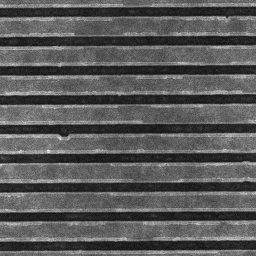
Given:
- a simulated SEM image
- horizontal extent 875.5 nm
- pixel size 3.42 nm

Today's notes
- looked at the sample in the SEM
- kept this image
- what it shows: parallel lines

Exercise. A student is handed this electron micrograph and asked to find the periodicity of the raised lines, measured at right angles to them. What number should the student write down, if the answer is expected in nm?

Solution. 99.9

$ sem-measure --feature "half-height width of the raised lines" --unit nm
65.4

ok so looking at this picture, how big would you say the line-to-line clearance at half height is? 10.4 pixels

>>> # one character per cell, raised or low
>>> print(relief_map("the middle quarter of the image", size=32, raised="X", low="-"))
--------------------------------
--------------------------------
--------------------------------
XXXXXXXXXXXXXXXXXXXXXXXXXXXXXXXX
XXXXXXXXXXXXXXXXXXXXXXXXXXXXXXXX
XXXXXXXXXXXXXXXXXXXXXXXXXXXXXXXX
XXXXXXXXXXXXXXXXXXXXXXXXXXXXXXXX
XXXXXXXXXXXXXXXXXX--------------
--------------------------------
--------------------------------
XXXXXXXXXXXXXXXXXXXXXXXXXXXXXXXX
XXXXXXXXXXXXXXXXXXXXXXXXXXXXXXXX
XXXXXXXXXXXXXXXXXXXXXXXXXXXXXXXX
XXXXXXXXXXXXXXXXXXXXXXXXXXXXXXXX
XXXXXXXXXXXXXXXXXXXXXXXXXXXXXXXX
--------------------------------
--------------------------------
---------------------------XXXXX
XXXXXXXXXXXXXXXXXXXXXXXXXXXXXXXX
XXXXXXXXXXXXXXXXXXXXXXXXXXXXXXXX
XXXXXXXXXXXXXXXXXXXXXXXXXXXXXXXX
XXXXXXXXXXXXXXXXXXXXXXXXXXXXXXXX
--------------------------------
--------------------------------
--------------------------------
XXXXXXXXXXXXXXXXXXXXXXXXXXXXXXXX
XXXXXXXXXXXXXXXXXXXXXXXXXXXXXXXX
XXXXXXXXXXXXXXXXXXXXXXXXXXXXXXXX
XXXXXXXXXXXXXXXXXXXXXXXXXXXXXXXX
XXXXXXXXXXXXXXX-----------------
--------------------------------
--------------------------------